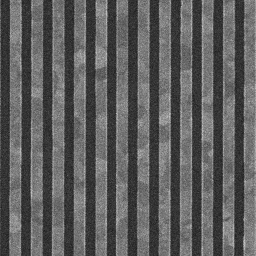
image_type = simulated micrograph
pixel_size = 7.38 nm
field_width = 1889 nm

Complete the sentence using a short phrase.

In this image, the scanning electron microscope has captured parallel lines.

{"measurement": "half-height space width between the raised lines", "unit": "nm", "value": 76.5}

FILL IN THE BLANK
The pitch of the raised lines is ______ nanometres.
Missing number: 157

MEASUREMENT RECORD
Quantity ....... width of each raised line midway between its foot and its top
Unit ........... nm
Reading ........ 82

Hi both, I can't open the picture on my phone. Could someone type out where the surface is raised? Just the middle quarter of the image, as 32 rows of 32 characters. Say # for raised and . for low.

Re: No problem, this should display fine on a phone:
...##...##...###...##...###..###
...##...##...###...##...###..###
...##...##...###...##...###..###
...##...##...###...##...###..###
...##...##...###...##...###..###
...##...##...###...##...##...###
...##...##...###...##...##...###
...##...##...###...##...##...###
...##...##...###...##...##...###
...##...##...###...##...##...###
...##...##...###...##...##...###
...##...###..###...##...##...###
...##...###..###...##...##...###
...##...###..###...##...##...###
...##...###..###...##...##...###
...##...###..###...##...###..###
...##...###..###...##...###..###
...##...###..###...##...###..###
...##...###..###...##...###..###
...##...###..###...##...###..###
...##...###..###...##...###..###
...##...###..###...##...##...###
...##...###..###...##...##...###
...##...###..###...##...###..###
...##...###..###...##...###..###
...##...###..###...##...###..###
...##...##...###...##...###..###
...##...##...###...##...###..###
...##...##...###...##...##...###
...##...##...###...##...##...###
...##...##...###...##...##...###
...##...###..###...##...##...###